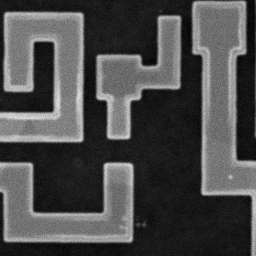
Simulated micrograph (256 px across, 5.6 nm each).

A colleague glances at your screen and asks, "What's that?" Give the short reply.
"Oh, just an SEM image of wiring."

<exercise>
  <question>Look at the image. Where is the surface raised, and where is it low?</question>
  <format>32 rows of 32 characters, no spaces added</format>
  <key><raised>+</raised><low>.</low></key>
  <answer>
........................+++++++.
........................+++++++.
.+++++++++..........++..+++++++.
.+++++++++..........++..+++++++.
.+++++++++..........++..+++++++.
.+++...+++..........++..+++++++.
.+++...+++..........++..+++++++.
.+++...+++..++++++..++...++++...
.+++...+++..++++++++++...++++...
.+++...+++..++++++++++...++++...
.+++...+++..++++++++++...++++...
.......+++..++++++.......++++...
.......+++...++++........++++...
.......+++...+++.........++++...
++++++++++...+++.........++++...
++++++++++...+++.........++++...
++++++++++...+++.........++++...
++++++++++...............++++...
.........................++++...
.........................++++...
++++.........+++.........+++++++
++++.........++++........+++++++
++++.........++++........+++++++
++++.........++++........+++++++
++++.........++++..............+
.+++.........++++...............
.+++.........++++...............
.++++++++++++++++...............
.++++++++++++++++...............
.++++++++++++++++...............
................................
................................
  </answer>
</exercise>